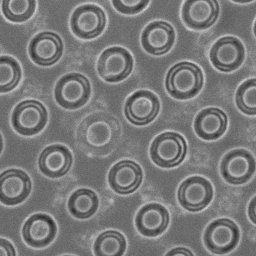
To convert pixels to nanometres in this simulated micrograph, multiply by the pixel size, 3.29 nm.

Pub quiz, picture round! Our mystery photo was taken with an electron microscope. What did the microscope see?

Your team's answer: a regular array of ring-shaped grooves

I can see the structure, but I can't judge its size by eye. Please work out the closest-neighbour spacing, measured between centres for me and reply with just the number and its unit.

165 nm